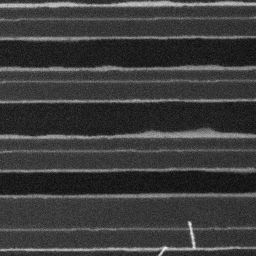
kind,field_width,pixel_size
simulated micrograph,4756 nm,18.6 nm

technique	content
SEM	lines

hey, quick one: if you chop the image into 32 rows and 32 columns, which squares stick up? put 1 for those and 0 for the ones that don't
00000000000000000000000000000000
11111111111111111111111111111111
11111111111111111111111111111111
11111111111111111111111111111111
11111111111111111111111111111111
00000000000000000000000000000000
00000000000000000000000000000000
00000000000000000000000000000000
00000000000000000000000000000000
11111111111111111111111111111111
11111111111111111111111111111111
11111111111111111111111111111111
11111111111111111111000000000000
00000000000000000000000000000000
00000000000000000000000000000000
00000000000000000000000000000000
00000000000000000000000000000000
11111111111111111111111111111111
11111111111111111111111111111111
11111111111111111111111111111111
11111111111111111111111111111111
00000000000000000000000000000000
00000000000000000000000000000000
00000000000000000000000000000000
00000000000000000000011111111111
11111111111111111111111111111111
11111111111111111111111111111111
11111111111111111111111111111111
11111111111111111111111111111111
11111111111111111111111111111111
11111111111111111111111111111111
00000000000000000000000000000000